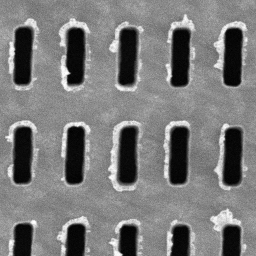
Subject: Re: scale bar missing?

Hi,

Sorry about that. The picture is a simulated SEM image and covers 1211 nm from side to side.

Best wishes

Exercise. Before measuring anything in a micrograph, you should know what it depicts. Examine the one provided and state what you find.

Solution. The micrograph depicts a regular array of holes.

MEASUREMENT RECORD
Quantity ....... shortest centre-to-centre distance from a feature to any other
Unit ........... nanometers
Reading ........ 248